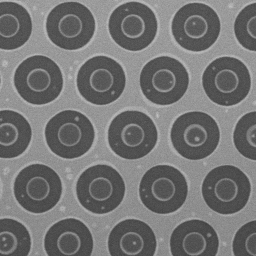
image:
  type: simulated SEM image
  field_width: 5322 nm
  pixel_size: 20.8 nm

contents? an array of small figures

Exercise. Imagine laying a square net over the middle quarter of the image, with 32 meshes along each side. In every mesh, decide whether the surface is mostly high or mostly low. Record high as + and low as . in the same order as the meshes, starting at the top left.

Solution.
++++...........+++++..........++
+++.....+++....++++............+
+++....+++++...++++....++++....+
+++....+++++....+++...++++++....
+++....+++++....+++...++++++...+
+++....+++++...++++....++++....+
+++.....+++....++++....++++....+
++++..........++++++..........++
+++++.........++++++.........+++
++++++......+++++++++.......++++
+++++++++.+++++++++++++..+++++++
...++++++++++++.....++++++++++++
.....++++++++........++++++++...
......++++++..........++++++....
.......++++...........+++++.....
+++....++++.....+++....++++.....
++++....+++....+++++...++++....+
++++....+++....+++++....++....++
++++....+++....+++++....++....++
++++....+++....++++....+++.....+
.......++++............++++.....
.......+++++..........+++++.....
.....++++++++........+++++++....
....++++++++++.....+++++++++++..
+++++++++.++++++++++++++++++++++
++++++......++++++++++......++++
+++++........++++++++........+++
++++..........++++++..........++
+++............++++............+
+++....++++....++++....++++....+
+++...++++++...++++...++++++...+
+++...++++++...++++...++++++...+